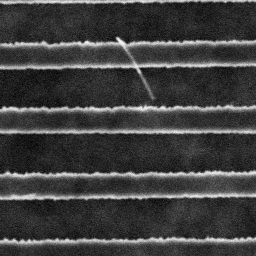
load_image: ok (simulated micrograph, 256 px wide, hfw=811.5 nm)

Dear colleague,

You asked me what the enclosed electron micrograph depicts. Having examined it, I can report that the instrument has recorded lines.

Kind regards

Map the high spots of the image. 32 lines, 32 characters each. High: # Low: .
................................
................................
................................
................................
................................
..####.#########################
################################
################################
###.####.........#..............
................................
................................
................................
................................
.#...#...#.#..##################
################################
################################
################################
................................
................................
................................
................................
..........................##...#
################################
################################
################################
................................
................................
................................
................................
................................
################################
################################